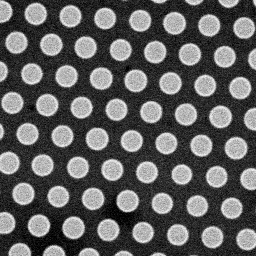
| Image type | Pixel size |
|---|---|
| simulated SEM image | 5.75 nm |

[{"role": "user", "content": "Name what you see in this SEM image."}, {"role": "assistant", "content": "an array of small figures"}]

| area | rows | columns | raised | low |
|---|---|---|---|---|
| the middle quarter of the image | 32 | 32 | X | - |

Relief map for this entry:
--------------------------------
XXX-----XXX---------------------
XXX----XXXXX----XXXX------XX----
XXX----XXXXX---XXXXX----XXXXX---
XXX----XXXXX---XXXXXX---XXXXX---
XX-----XXXX-----XXXX----XXXXX---
-----------------XX------XXXX---
--------------------------------
---XX---------------------------
--XXXX------XXX------XX---------
--XXXXX----XXXX-----XXXX-----XXX
--XXXXX----XXXXX---XXXXX----XXXX
--XXXX-----XXXX----XXXXX----XXXX
------------XXX-----XXXX----XXXX
---------------------X-------XXX
--------------------------------
XX-----XX-----------------------
XX----XXXXX----XXXX------XX-----
XX----XXXXX----XXXX-----XXXX----
XX----XXXXX---XXXXX----XXXXX----
------XXXX-----XXXX----XXXXX----
----------------XX------XXXX----
--------------------------------
---X----------------------------
-XXXXX----XXXX------------------
-XXXXX----XXXX-----XXXX------X--
-XXXXX----XXXXX---XXXXX-----XXXX
--XXXX----XXXX----XXXXX----XXXXX
----------XXXX-----XXXX----XXXXX
---------------------X------XXX-
--------------------------------
------XX------------------------